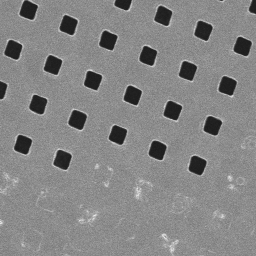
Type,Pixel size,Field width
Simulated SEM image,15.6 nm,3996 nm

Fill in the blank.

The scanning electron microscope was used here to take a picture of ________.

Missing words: a regular array of holes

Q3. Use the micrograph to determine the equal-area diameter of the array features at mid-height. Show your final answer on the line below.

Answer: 278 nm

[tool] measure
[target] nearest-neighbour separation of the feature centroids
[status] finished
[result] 42.4 pixels